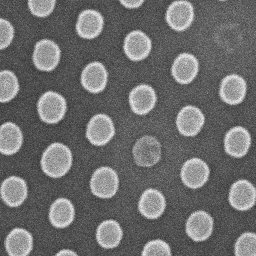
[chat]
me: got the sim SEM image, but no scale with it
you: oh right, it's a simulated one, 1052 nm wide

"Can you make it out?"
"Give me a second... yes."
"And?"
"a regular array of raised bodies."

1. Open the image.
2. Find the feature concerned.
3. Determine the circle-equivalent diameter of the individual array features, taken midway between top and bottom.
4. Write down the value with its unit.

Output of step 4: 114 nm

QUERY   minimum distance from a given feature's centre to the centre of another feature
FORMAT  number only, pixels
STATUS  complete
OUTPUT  52.2